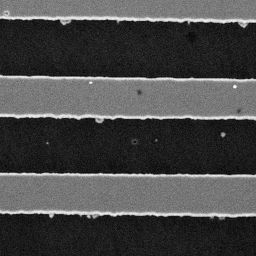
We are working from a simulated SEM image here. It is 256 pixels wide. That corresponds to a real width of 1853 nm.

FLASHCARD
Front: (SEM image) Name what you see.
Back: lines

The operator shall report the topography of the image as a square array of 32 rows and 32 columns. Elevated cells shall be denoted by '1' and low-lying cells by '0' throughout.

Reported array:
11111111111111111111111111111111
11111111111111111111111111111111
00000000000000011111111111111111
00000000000000000000000000000000
00000000000000000000000000000000
00000000000000000000000000000000
00000000000000000000000000000000
00000000000000000000000000000000
00000000000000000000000000000000
00000000000000000000000000000000
11111111111111111111111111111111
11111111111111111111111111111111
11111111111111111111111111111111
11111111111111111111111111111111
11111111111111111111111111111111
00000000000000000000000000000000
00000000000000000000000000000000
00000000000000000000000000000000
00000000000000000000000000000000
00000000000000000000000000000000
00000000000000000000000000000000
00000000000000000000000000000000
11111111111111111111111111111111
11111111111111111111111111111111
11111111111111111111111111111111
11111111111111111111111111111111
11111111111111111111111111111111
00000000000000000000000000000000
00000000000000000000000000000000
00000000000000000000000000000000
00000000000000000000000000000000
00000000000000000000000000000000